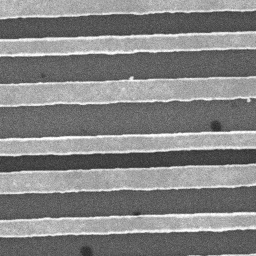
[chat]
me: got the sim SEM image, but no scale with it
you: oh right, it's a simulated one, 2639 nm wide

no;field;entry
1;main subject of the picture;lines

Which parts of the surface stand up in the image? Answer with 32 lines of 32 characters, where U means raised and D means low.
UUUUUUUUUUUUUUUUUUUUUUUUUUUUUUUU
UUUUUUUUUUUUUUUUUUUUUUDUDDDDDDDD
DDDDDDDDDDDDDDDDDDDDDDDDDDDDDDDD
DDDDDDDDDDDDDDDDDDDDDDDDDDDDDDDD
DDDDDDDDDDDDDDDDDUUUUUUUUUUUUUUU
UUUUUUUUUUUUUUUUUUUUUUUUUUUUUUUU
UUUUUUUUUUUUUUUUUDDDDDDDDDDDDDDD
DDDDDDDDDDDDDDDDDDDDDDDDDDDDDDDD
DDDDDDDDDDDDDDDDDDDDDDDDDDDDDDDD
DDDDDDDDDDDDDDDDDDDDDDDDDDDDDDDD
DUUUUUUUUUUUUUUUUUUUUUUUUUUUUUUU
UUUUUUUUUUUUUUUUUUUUUUUUUUUUUUUU
UUUUUUUUUUUUUUUUUUUUUUUUDDDDDDDD
DDDDDDDDDDDDDDDDDDDDDDDDDDDDDDDD
DDDDDDDDDDDDDDDDDDDDDDDDDDDDDDDD
DDDDDDDDDDDDDDDDDDDDDDDDDDDDDDDD
DDDDDDDDDDDDDDDDDDDDDDDDDDDDDUUU
UUUUUUUUUUUUUUUUUUUUUUUUUUUUUUUU
UUUUUUUUUUUUUUUUUUUUUUUUUUUUUUUU
DDDDDDDDDDDDDDDDDDDDDDDDDDDDDDDD
DDDDDDDDDDDDDDDDDDDDDDDDDDDDDDDD
DDUUUUUUUUUUUUUUUUUUUUUUUUUUUUUU
UUUUUUUUUUUUUUUUUUUUUUUUUUUUUUUU
UUUUUUUUUUUUUUUUUUUUUUUUUDDDDDDD
DDDDDDDDDDDDDDDDDDDDDDDDDDDDDDDD
DDDDDDDDDDDDDDDDDDDDDDDDDDDDDDDD
DDDDDDDDDDDDDDDDDDDDDDDDDDDDDDDD
DDUUUUUUUUUUUUUUUUUUUUUUUUUUUUUU
UUUUUUUUUUUUUUUUUUUUUUUUUUUUUUUU
UUUUDDDDDDDDDDDDDDDDDDDDDDDDDDDD
DDDDDDDDDDDDDDDDDDDDDDDDDDDDDDDD
DDDDDDDDDDDDDDDDDDDDDDDDDDDDDDDD